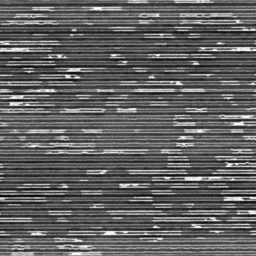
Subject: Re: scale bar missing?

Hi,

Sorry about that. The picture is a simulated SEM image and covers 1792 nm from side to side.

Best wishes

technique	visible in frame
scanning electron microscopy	parallel lines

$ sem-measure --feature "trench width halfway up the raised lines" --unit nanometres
20.1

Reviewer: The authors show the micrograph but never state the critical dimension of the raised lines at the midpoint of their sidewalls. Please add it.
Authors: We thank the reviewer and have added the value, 3.87 pixels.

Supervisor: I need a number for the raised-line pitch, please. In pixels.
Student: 6.8